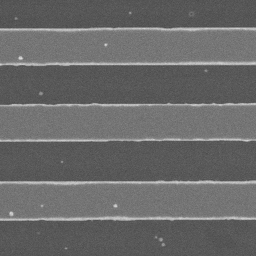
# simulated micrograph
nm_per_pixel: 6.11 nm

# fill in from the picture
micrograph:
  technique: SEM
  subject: lines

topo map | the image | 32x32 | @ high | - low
--------------------------------
--------------------------------
--------------------------------
--------------------------------
@@@@@@@@@@@@@@@@@@@@@@@@@@@@@@@@
@@@@@@@@@@@@@@@@@@@@@@@@@@@@@@@@
@@@@@@@@@@@@@@@@@@@@@@@@@@@@@@@@
@@@@@@@@@@@@@@@@@@@@@@@@@@@@@@@@
--------------------------------
--------------------------------
--------------------------------
--------------------------------
--------------------------------
@@@@@@@@@@@@@@@@@@@@@@@@@@@@@@@@
@@@@@@@@@@@@@@@@@@@@@@@@@@@@@@@@
@@@@@@@@@@@@@@@@@@@@@@@@@@@@@@@@
@@@@@@@@@@@@@@@@@@@@@@@@@@@@@@@@
@@@@@@@@@@@@@@@@@@@@@@@@@@@@@@@@
--------------------------------
--------------------------------
--------------------------------
--------------------------------
--------------------------------
@@@@@@@@@@@@@@@@@@@@@@@@@@@@@@@@
@@@@@@@@@@@@@@@@@@@@@@@@@@@@@@@@
@@@@@@@@@@@@@@@@@@@@@@@@@@@@@@@@
@@@@@@@@@@@@@@@@@@@@@@@@@@@@@@@@
@@@@@@@@@@@----@@---------------
--------------------------------
--------------------------------
--------------------------------
--------------------------------